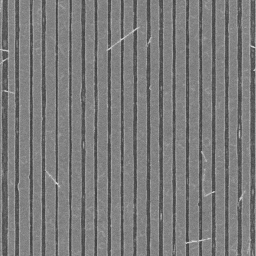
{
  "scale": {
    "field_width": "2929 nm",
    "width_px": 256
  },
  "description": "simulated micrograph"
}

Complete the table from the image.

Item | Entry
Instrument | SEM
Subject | parallel lines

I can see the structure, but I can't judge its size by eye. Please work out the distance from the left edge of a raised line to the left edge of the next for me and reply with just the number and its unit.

149 nanometres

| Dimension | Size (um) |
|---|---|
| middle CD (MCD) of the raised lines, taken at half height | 0.107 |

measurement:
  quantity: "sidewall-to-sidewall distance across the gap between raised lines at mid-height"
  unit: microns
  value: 0.0429